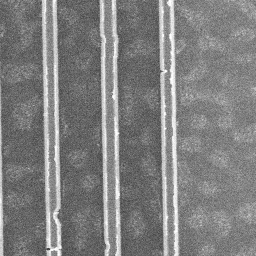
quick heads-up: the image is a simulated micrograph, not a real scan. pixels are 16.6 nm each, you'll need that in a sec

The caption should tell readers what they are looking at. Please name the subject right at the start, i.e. parallel lines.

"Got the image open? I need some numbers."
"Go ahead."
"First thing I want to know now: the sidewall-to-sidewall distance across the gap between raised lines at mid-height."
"774 nm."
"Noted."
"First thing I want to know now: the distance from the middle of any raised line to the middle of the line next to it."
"974 nanometres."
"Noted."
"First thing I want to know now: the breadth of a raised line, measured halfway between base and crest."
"0.198 micrometres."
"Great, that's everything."